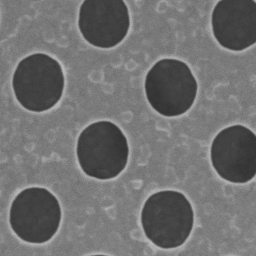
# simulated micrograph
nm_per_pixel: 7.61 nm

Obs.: holes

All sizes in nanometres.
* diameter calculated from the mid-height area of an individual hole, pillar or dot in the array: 417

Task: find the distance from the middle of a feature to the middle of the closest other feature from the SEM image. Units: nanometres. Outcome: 710